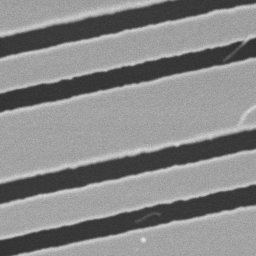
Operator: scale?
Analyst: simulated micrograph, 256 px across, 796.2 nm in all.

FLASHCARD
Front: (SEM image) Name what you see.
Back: lines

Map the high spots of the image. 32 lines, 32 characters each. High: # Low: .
###################.............
###############...........######
##########............##########
######...........###############
#............###################
........#####################...
...######################.......
###################...........##
###############...........######
##########...........###########
#####...........################
#...........####################
........########################
..##############################
################################
################################
##############################..
##########################......
#####################...........
#################...........####
############...........#########
#######...........##############
##............##################
.........#####################..
....######################......
#####################...........
################...........#####
###########............#########
#######...........##############
##...........###################
.........#######################
...#############################